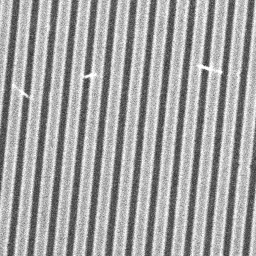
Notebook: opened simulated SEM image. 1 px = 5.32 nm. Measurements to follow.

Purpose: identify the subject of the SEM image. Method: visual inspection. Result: parallel lines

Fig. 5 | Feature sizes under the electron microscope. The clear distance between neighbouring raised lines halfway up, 8.33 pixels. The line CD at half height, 59.5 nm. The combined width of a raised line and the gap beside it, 104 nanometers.